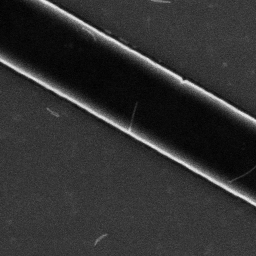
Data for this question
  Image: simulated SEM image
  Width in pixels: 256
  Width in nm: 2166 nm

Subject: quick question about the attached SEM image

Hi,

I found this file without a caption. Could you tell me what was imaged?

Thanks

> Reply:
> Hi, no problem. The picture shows one or a few lines or trenches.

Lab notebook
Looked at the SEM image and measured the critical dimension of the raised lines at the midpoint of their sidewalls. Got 0.618 µm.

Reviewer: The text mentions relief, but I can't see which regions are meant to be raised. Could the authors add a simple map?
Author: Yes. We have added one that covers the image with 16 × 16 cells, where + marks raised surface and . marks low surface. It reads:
++++............
+++++...........
+++++++.........
+++++++++.......
.++++++++++.....
...+++++++++....
.....+++++++++..
.......+++++++++
........++++++++
..........++++++
............++++
..............++
...............+
................
................
................